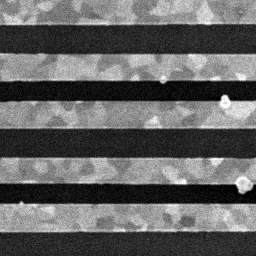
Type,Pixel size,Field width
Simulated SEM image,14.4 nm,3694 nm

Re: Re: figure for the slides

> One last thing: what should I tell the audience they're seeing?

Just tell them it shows lines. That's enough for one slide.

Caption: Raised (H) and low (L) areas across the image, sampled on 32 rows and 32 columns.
HHHHHHHHHHHHHHHHHHHHHHHHHHHHHHHH
HHHHHHHHHHHHHHHHHHHHHHHHHHHHHHHH
HHHHHHHHHHHHHHHHHHHHHHHHHHHHHHHH
LLLLLLLLLLLLLLLLLLLLLLLLLLLLLLLL
LLLLLLLLLLLLLLLLLLLLLLLLLLLLLLLL
LLLLLLLLLLLLLLLLLLLLLLLLLLLLLLLL
LLLLLLLLLLLLLLLLLLLLLLLLLLLLLLLL
HHHHHHHHHHHHHHHHHHHHHHHHHHHHHHHH
HHHHHHHHHHHHHHHHHHHHHHHHHHHHHHHH
HHHHHHHHHHHHHHHHHHHHHHHHHHHHHHHH
LLLLLLLLLLLLLLLLLLLLLLLLLLLLLLLL
LLLLLLLLLLLLLLLLLLLLLLLLLLLLLLLL
LLLLLLLLLLLLLLLLLLLLLLLLLLLHHLLL
HHHHHHHHHHHHHHHHHHHHHHHHHHHHHHHH
HHHHHHHHHHHHHHHHHHHHHHHHHHHHHHHH
HHHHHHHHHHHHHHHHHHHHHHHHHHHHHHHH
LLLLLLLLLLLLLLLLLLLLLLLLLLLLLLLL
LLLLLLLLLLLLLLLLLLLLLLLLLLLLLLLL
LLLLLLLLLLLLLLLLLLLLLLLLLLLLLLLL
LLLLLLLLLLLLLLLLLLLLLLLLLLLLLLLL
HHHHHHHHHHHHHHHHHHHHHHHHHHHHHHHH
HHHHHHHHHHHHHHHHHHHHHHHHHHHHHHHH
HHHHHHHHHHHHHHHHHHHHHHHHHHHHHHHH
LLLLLLLLLLLLLLLLLLLLLLLLLLLLLLHL
LLLLLLLLLLLLLLLLLLLLLLLLLLLLLLLL
LLHLLLLLLLLLLLLLLLLLLLLLLLLLLLLL
HHHHHHHHHHHHHHHHHHHHHHHHHHHHHHHH
HHHHHHHHHHHHHHHHHHHHHHHHHHHHHHHH
HHHHHHHHHHHHHHHHHHHHHHHHHHHHHHHH
LLLLLLLLLLLLLLLLLLLLLLLLLLLLLLLL
LLLLLLLLLLLLLLLLLLLLLLLLLLLLLLLL
LLLLLLLLLLLLLLLLLLLLLLLLLLLLLLLL